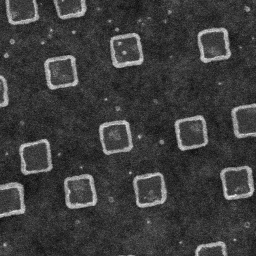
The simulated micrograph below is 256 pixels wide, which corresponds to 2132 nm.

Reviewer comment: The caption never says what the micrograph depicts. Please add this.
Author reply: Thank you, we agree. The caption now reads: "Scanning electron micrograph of a regular array of raised bodies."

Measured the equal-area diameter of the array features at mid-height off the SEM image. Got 32 pixels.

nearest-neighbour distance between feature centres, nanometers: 565